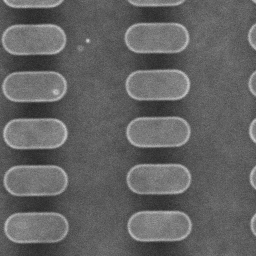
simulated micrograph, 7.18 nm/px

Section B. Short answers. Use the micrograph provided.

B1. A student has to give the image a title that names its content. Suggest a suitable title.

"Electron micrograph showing groups of lines, slits or small figures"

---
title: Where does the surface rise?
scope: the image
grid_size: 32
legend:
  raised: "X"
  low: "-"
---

-XXXXXX----------XXXXX----------
--------------------------------
--------------------------------
-XXXXXX---------XXXXXXX---------
XXXXXXXX--------XXXXXXX--------X
XXXXXXXX--------XXXXXXX--------X
-XXXXXX----------XX-------------
--------------------------------
--------------------------------
-XXXXXXX--------XXXXXXX--------X
XXXXXXXX--------XXXXXXXX-------X
-XXXXXXX--------XXXXXXX---------
-XXXXXX-------------------------
--------------------------------
--------------------------------
-XXXXXXX--------XXXXXXX--------X
-XXXXXXX--------XXXXXXXX-------X
-XXXXXXX--------XXXXXXX---------
--XXX---------------------------
--------------------------------
--------------------------------
-XXXXXXX--------XXXXXXXX--------
-XXXXXXX--------XXXXXXXX-------X
-XXXXXXX--------XXXXXXX---------
--------------------------------
--------------------------------
--------------------------------
-XXXXXXX--------XXXXXXXX--------
-XXXXXXX--------XXXXXXXX-------X
-XXXXXXX---------XXXXXX---------
--------------------------------
--------------------------------